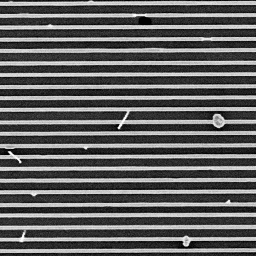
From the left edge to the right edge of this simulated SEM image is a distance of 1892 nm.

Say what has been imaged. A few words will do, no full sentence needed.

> parallel lines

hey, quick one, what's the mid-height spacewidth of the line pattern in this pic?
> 64.6 nanometres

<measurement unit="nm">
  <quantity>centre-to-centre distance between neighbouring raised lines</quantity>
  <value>87.1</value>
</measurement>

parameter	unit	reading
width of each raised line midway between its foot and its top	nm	25.9